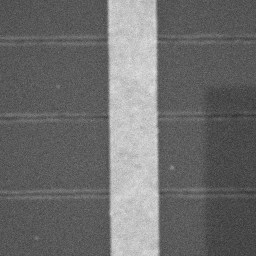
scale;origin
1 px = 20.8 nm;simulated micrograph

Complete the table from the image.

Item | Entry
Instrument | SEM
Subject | wiring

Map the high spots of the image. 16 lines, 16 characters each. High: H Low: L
LLLLLLLHHHLLLLLL
LLLLLLLHHHLLLLLL
LLLLLLLHHHLLLLLL
LLLLLLLHHHLLLLLL
LLLLLLLHHHLLLLLL
LLLLLLLHHHLLLLLL
LLLLLLLHHHLLLLLL
LLLLLLLHHHLLLLLL
LLLLLLLHHHLLLLLL
LLLLLLLHHHLLLLLL
LLLLLLLHHHLLLLLL
LLLLLLLHHHLLLLLL
LLLLLLLHHHLLLLLL
LLLLLLLHHHLLLLLL
LLLLLLLHHHLLLLLL
LLLLLLLHHHLLLLLL